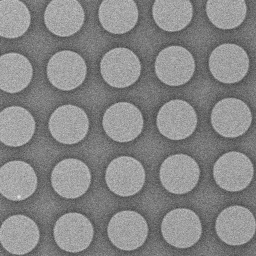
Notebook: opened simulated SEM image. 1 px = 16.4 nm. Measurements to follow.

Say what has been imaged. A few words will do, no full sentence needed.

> an array of small figures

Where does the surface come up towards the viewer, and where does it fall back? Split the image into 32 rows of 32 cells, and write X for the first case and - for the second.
XXX---XXXX---XXXX--XXXXX--XXXXX-
XXXX--XXXX--XXXXX--XXXXX--XXXXX-
XXXX--XXXX---XXXX--XXXXX--XXXX--
XXX---XXXX---XXX----XXX-----X---
XX------------------------------
--------------------------------
--------X-----XX----XXXX---XXXX-
XXX---XXXX---XXXX---XXXX--XXXXX-
XXXX--XXXXX--XXXX--XXXXX--XXXXX-
XXXX--XXXXX--XXXX---XXXX---XXX--
XXX----XXX----XX-----XX---------
-X------------------------------
----------------------------XX--
-XX----XXX----XXX---XXXX---XXXX-
XXXX--XXXXX--XXXXX--XXXX--XXXXX-
XXXX--XXXXX--XXXXX--XXXX---XXXX-
XXXX--XXXXX--XXXX---XXXX---XXXX-
XXXX---XXX----XX----------------
--------------------------------
----------------------X-----XXX-
-XX----XXX----XXXX--XXXXX--XXXX-
XXXX---XXXX--XXXXX--XXXXX--XXXXX
XXXXX--XXXX--XXXXX--XXXXX--XXXX-
XXXX---XXXX---XXXX---XXX----XX--
-XXX----XX----------------------
--------------------------------
---------------XX----XXX----XXX-
-XXX---XXXX---XXXX--XXXXX--XXXXX
XXXXX--XXXXX--XXXX--XXXXX--XXXXX
XXXXX--XXXXX--XXXX--XXXXX--XXXXX
XXXXX--XXXX---XXXX---XXX-----X--
-XX-----------------------------